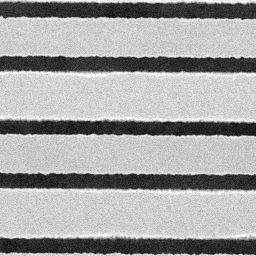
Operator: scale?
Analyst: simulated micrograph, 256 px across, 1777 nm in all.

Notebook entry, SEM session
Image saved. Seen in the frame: lines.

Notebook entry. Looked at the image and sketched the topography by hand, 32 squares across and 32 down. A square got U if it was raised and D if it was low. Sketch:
DDDDDDDDDDDDDDDDDDDDDDDDDDDDDDDD
DDDDDDDDDDDDDDDDDDDDDDDDDDDDDDDD
UUUUUUUUUUUUUUUUUUUUUUUUUUUUUUUU
UUUUUUUUUUUUUUUUUUUUUUUUUUUUUUUU
UUUUUUUUUUUUUUUUUUUUUUUUUUUUUUUU
UUUUUUUUUUUUUUUUUUUUUUUUUUUUUUUU
UUUUUUUUUUUUUUUUUUUUUUUUUUUUUUUU
DDDDDDDDDDDDDDDDDDDDDDDDDDDDDDDD
DDDDDDDDDDDDDDDDDDDDDDDDDDDDDDDD
UUUUUUUUUUUUUUUUUUUUUUUUUUUUUUUU
UUUUUUUUUUUUUUUUUUUUUUUUUUUUUUUU
UUUUUUUUUUUUUUUUUUUUUUUUUUUUUUUU
UUUUUUUUUUUUUUUUUUUUUUUUUUUUUUUU
UUUUUUUUUUUUUUUUUUUUUUUUUUUUUUUU
UUUUUUUUUUUUUUUUUUUUUUUUUUUUUUUU
DDDDDDDDDDDDDDDDDDDDDDDDDDDDDDDD
DDDDDDDDDDDDDDDDDDDDDDDDDDDDDDDD
UUUUUUUUUUUUUUUUUUUUUUUUUUUUUUUU
UUUUUUUUUUUUUUUUUUUUUUUUUUUUUUUU
UUUUUUUUUUUUUUUUUUUUUUUUUUUUUUUU
UUUUUUUUUUUUUUUUUUUUUUUUUUUUUUUU
UUUUUUUUUUUUUUUUUUUUUUUUUUUUUUUU
DDDDDDDDDDDDDDDDDDDDDDDDDDDDDDDD
DDDDDDDDDDDDDDDDDDDDDDDDDDDDDDDD
UUUUUUUUUUUUUUUUUUUUUUUUUUUUUUUU
UUUUUUUUUUUUUUUUUUUUUUUUUUUUUUUU
UUUUUUUUUUUUUUUUUUUUUUUUUUUUUUUU
UUUUUUUUUUUUUUUUUUUUUUUUUUUUUUUU
UUUUUUUUUUUUUUUUUUUUUUUUUUUUUUUU
UUUUUUUUUUUUUUUUUUUUUUUUUUUUUUUU
DDDDDDDDDDDDDDDDDDDDDDDDDDDDDDDD
DDDDDDDDDDDDDDDDDDDDDDDDDDDDDDDD